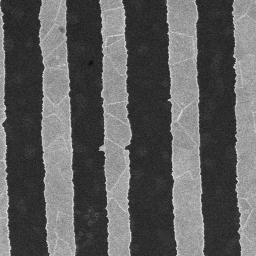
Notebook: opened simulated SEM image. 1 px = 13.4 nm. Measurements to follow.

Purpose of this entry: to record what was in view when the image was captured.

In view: one or a few lines or trenches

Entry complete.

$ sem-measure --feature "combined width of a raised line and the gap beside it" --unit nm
862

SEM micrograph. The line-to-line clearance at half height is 510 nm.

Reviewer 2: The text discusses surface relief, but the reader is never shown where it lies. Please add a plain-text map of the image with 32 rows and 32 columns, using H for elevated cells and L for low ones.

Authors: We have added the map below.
LLLLLHHHLLLLLHHLLLLLLHHHLLLLLHHH
LLLLLHHHLLLLLHHHLLLLLHHHHLLLLHHH
LLLLLHHHLLLLLHHHLLLLLHHHHLLLLHHH
LLLLLHHHLLLLLHHHLLLLLHHHLLLLLHHH
LLLLLHHHLLLLLHHHLLLLLHHHHLLLLHHH
HLLLLHHHLLLLLHHHLLLLLHHHHLLLLHHH
LLLLLHHHLLLLLHHHLLLLLHHHHLLLLHHH
HLLLLHHHLLLLLHHHLLLLLHHHHLLLLHHH
HLLLLLHHLLLLLHHHLLLLLHHHHLLLLHHH
HLLLLHHHHLLLLHHHLLLLLHHHHLLLLLHH
LLLLLHHHHLLLLHHHLLLLLHHHHLLLLHHH
LLLLLHHHHLLLLHHHLLLLLHHHHLLLLHHH
LLLLLHHHHLLLLHHHLLLLLHHHHLLLLLHH
HLLLLHHHHLLLLHHHLLLLLHHHHLLLLHHH
HLLLLHHHHLLLLHHHLLLLLLHHHLLLLHHH
LLLLLHHHHLLLLHHHLLLLLHHHHLLLLLHH
HLLLLHHHHLLLLHHHLLLLLHHHHLLLLLHH
HLLLLHHHHLLLLHHHLLLLLLHHHLLLLLHH
HLLLLHHHHLLLLHHHLLLLLLHHHLLLLLHH
HLLLLHHHHLLLLHHHLLLLLLHHHLLLLLHH
HLLLLLHHHLLLLHHHLLLLLLHHHLLLLLHH
HLLLLLHHHLLLLHHHLLLLLLHHHLLLLLHH
HLLLLLHHHLLLLHHHLLLLLLHHHLLLLLHH
HLLLLLHHHLLLLHHHLLLLLLHHHLLLLLHH
HLLLLLHHHLLLLHHHLLLLLLHHHLLLLLHH
HLLLLLHHHLLLLHHHLLLLLLHHHLLLLLHH
HLLLLLHHHLLLLHHHLLLLLLHHHLLLLLHH
HLLLLLHHHLLLLLHHLLLLLLHHHLLLLLHH
HLLLLLHHHLLLLHHHLLLLLLHHHLLLLLHH
HLLLLLHHHLLLLLHHLLLLLLHHHLLLLLHH
HLLLLLHHHHLLLLHHLLLLLLHHHLLLLLHH
HLLLLLHHHHLLLLHHLLLLLLHHHLLLLLHH